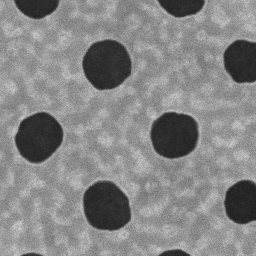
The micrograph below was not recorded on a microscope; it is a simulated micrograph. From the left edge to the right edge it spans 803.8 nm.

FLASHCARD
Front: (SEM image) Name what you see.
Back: holes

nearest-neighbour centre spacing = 306 nm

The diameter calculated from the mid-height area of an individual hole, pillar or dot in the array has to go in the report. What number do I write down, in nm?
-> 153